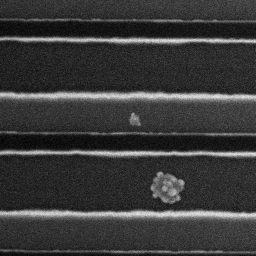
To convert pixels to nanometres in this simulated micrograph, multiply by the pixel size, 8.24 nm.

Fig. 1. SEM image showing lines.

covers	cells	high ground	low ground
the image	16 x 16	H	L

HHHHHHHHHHHHHHHH
HHHHHHHHHHHHHHHH
LLLLLLLLLLLLLLLL
LLLLLLLLLLLLLLLL
LLLLLLLLLLLLLLLL
LLLLLLLLLLLLLLLL
HHHHHHHHHHHHHHHH
HHHHHHHHHHHHHHHH
HHHHHHHHHHHHHHHH
LLLLLLHHHHHHHHHH
LLLLLLLLLLLLLLLL
LLLLLLLLLLLLLLLL
LLLLLLLLLLLLLLLL
HHHHHHHHHHHHHHHH
HHHHHHHHHHHHHHHH
HHHHHHHHHHHHHHHH